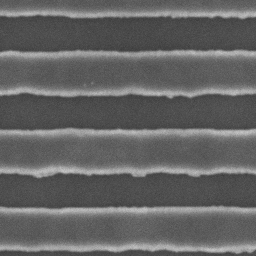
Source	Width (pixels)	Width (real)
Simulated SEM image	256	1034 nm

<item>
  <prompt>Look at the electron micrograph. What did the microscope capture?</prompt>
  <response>lines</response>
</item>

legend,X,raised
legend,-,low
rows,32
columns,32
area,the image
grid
XXXXXXXXXXXXXXXXXXXXXXXXXXXXXXXX
XXXXXXXXXXXXXXXXXXXXXXXXXXXXXXXX
--------------------------------
--------------------------------
--------------------------------
--------------------------------
-X-------XXXX------XXXXXXXXX-XX-
XXXXXXXXXXXXXXXXXXXXXXXXXXXXXXXX
XXXXXXXXXXXXXXXXXXXXXXXXXXXXXXXX
XXXXXXXXXXXXXXXXXXXXXXXXXXXXXXXX
XXXXXXXXXXXXXXXXXXXXXXXXXXXXXXXX
XXXXXXXXXXXXXXXXXXXXXXXXXXXXXXXX
--------------------------------
--------------------------------
--------------------------------
--------------------------------
XXXXXXXXXXXXXXXXXXXXXXXXXXXXXXXX
XXXXXXXXXXXXXXXXXXXXXXXXXXXXXXXX
XXXXXXXXXXXXXXXXXXXXXXXXXXXXXXXX
XXXXXXXXXXXXXXXXXXXXXXXXXXXXXXXX
XXXXXXXXXXXXXXXXXXXXXXXXXXXXXXXX
XXXXXX--XXXXXXXXXXXXXXXXXXXXXXXX
--------------------------------
--------------------------------
--------------------------------
--------------------------------
XXXXXXXXXXXXXXXXXXXXXXXXXXXXXXXX
XXXXXXXXXXXXXXXXXXXXXXXXXXXXXXXX
XXXXXXXXXXXXXXXXXXXXXXXXXXXXXXXX
XXXXXXXXXXXXXXXXXXXXXXXXXXXXXXXX
XXXXXXXXXXXXXXXXXXXXXXXXXXXXXXXX
--------------------------X-----